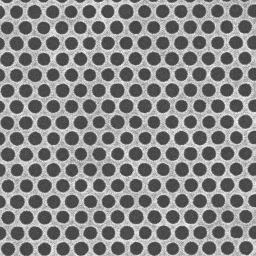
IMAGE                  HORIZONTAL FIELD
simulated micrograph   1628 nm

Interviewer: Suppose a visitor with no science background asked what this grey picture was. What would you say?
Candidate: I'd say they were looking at a regular array of holes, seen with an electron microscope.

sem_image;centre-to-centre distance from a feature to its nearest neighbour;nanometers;113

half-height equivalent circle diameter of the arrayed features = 13.6 px